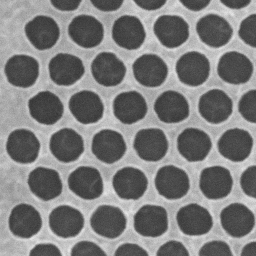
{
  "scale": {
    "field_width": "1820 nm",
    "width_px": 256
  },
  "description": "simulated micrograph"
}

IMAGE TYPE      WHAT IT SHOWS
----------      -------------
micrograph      a regular array of holes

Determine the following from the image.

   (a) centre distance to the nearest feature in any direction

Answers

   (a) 300 nm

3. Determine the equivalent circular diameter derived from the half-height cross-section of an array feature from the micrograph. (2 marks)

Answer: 249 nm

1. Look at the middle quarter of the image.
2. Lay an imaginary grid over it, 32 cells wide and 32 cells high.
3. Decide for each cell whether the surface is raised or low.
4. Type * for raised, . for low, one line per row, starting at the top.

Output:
.....*.........**.........**....
.....**.........*.........**....
.....**........**.........**....
....***........***........***...
...*****.......****......****...
**********...*******....*******.
*****..*************************
***.....******.....*****......**
*........****.......***........*
*.........**.........**........*
*.........**.........*.........*
*.........**.........*.........*
**........**.........**........*
***......****.......****.......*
****....******.....******....***
********************************
...******...*******.....******..
....****......****.......****...
.....**........***........**....
.....**........**.........**....
.....**.........*.........**....
.....**.........*.........**....
....***........***........***...
....****.......****......*****..
...*******...*********.********.
****...******************...****
***......****......*****......**
*........****.......***........*
*.........**.........**........*
*.........**.........*.........*
*.........**.........**.........
**........**.........**........*